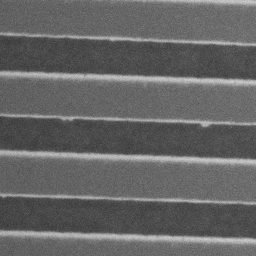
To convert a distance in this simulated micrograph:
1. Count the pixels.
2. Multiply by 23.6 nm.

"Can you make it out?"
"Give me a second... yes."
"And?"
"lines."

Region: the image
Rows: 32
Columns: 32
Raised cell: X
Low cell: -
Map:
XXXXXXXXXXXXXXXXXXXXXXXXXXXXXXXX
XXXXXXXXXXXXXXXXXXXXXXXXXXXXXXXX
XXXXXXXXXXXXXXXXXXXXXXXXXXXXXXXX
XXXXXXXXXXXXXXXXXXXXXXXXXXXXXXXX
------XXXXXXXXXXXXXXXXXXXXXXXXXX
---------------------------XXXXX
--------------------------------
--------------------------------
--------------------------------
XXXXXXXXXXXXX-------------------
XXXXXXXXXXXXXXXXXXXXXXXXXXXXXXXX
XXXXXXXXXXXXXXXXXXXXXXXXXXXXXXXX
XXXXXXXXXXXXXXXXXXXXXXXXXXXXXXXX
XXXXXXXXXXXXXXXXXXXXXXXXXXXXXXXX
-XXXXXXXXXXXXXXXXXXXXXXXXXXXXXXX
-----------------------------XXX
--------------------------------
--------------------------------
--------------------------------
XXXXXXXXXXXXXXXX----------------
XXXXXXXXXXXXXXXXXXXXXXXXXXXXXXXX
XXXXXXXXXXXXXXXXXXXXXXXXXXXXXXXX
XXXXXXXXXXXXXXXXXXXXXXXXXXXXXXXX
XXXXXXXXXXXXXXXXXXXXXXXXXXXXXXXX
---XXXXXXXXXXXXXXXXXXXXXXXXXXXXX
--------------------------------
--------------------------------
--------------------------------
--------------------------------
XXXXXXXXXXXXXXXXXX--------------
XXXXXXXXXXXXXXXXXXXXXXXXXXXXXXXX
XXXXXXXXXXXXXXXXXXXXXXXXXXXXXXXX